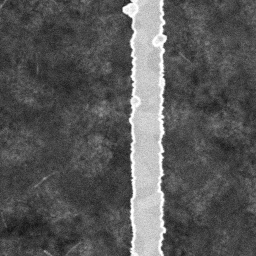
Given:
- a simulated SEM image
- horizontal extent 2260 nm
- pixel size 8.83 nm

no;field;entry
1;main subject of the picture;one or a few lines or trenches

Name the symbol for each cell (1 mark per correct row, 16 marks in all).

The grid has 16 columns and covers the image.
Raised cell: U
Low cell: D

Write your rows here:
DDDDDDDDUUDDDDDD
DDDDDDDDUUDDDDDD
DDDDDDDDUUDDDDDD
DDDDDDDDUUDDDDDD
DDDDDDDDUUDDDDDD
DDDDDDDDUUDDDDDD
DDDDDDDDUUDDDDDD
DDDDDDDDUUDDDDDD
DDDDDDDDUUDDDDDD
DDDDDDDDUUDDDDDD
DDDDDDDDUUDDDDDD
DDDDDDDDUUDDDDDD
DDDDDDDDUUDDDDDD
DDDDDDDDUUDDDDDD
DDDDDDDDUUDDDDDD
DDDDDDDDUUDDDDDD